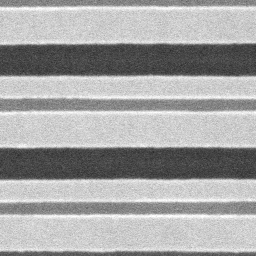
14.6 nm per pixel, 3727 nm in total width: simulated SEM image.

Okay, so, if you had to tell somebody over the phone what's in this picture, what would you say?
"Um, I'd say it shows lines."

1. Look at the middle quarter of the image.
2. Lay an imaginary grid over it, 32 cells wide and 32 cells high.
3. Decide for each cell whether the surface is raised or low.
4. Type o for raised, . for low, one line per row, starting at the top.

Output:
................................
................................
................................
oooooooooooooooooooooooooooooooo
oooooooooooooooooooooooooooooooo
oooooooooooooooooooooooooooooooo
oooooooooooooooooooooooooooooooo
oooooooooooooooooooooooooooooooo
oooooooooooooooooooooooooooooooo
oooooooooooooooooooooooooooooooo
oooooooooooooooooooooooooooooooo
oooooooooooooooooooooooooooooooo
oooooooooooooooooooooooooooooooo
oooooooooooooooooooooooooooooooo
oooooooooooooooooooooooooooooooo
oooooooooooooooooooooooooooooooo
oooooooooooooooooooooooooooooooo
oooooooooooooooooooooooooooooooo
oooooooooooooooooooooooooooooooo
oooooooooooooooooooooooooooooooo
oooooooooooooooooooooooooooooooo
................................
................................
................................
................................
................................
................................
................................
................................
oooooooooooooooooooooooooooooooo
oooooooooooooooooooooooooooooooo
oooooooooooooooooooooooooooooooo